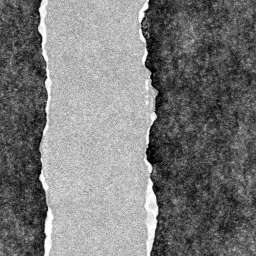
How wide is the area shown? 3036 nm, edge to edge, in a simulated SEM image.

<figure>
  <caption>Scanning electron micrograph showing one or a few lines or trenches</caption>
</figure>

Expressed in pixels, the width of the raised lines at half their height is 104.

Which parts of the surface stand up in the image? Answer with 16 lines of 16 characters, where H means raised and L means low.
LLLHHHHHHLLLLLLL
LLLHHHHHHLLLLLLL
LLLHHHHHHLLLLLLL
LLLHHHHHHLLLLLLL
LLLHHHHHHLLLLLLL
LLLHHHHHHHLLLLLL
LLLHHHHHHHLLLLLL
LLLHHHHHHHLLLLLL
LLLHHHHHHLLLLLLL
LLLHHHHHHLLLLLLL
LLLHHHHHHLLLLLLL
LLLHHHHHHLLLLLLL
LLLHHHHHHHLLLLLL
LLLHHHHHHHLLLLLL
LLLHHHHHHLLLLLLL
LLLHHHHHHLLLLLLL